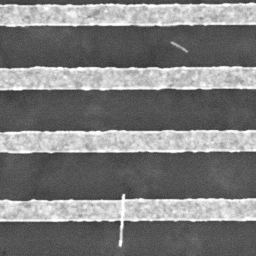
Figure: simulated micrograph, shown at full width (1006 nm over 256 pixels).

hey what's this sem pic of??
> lines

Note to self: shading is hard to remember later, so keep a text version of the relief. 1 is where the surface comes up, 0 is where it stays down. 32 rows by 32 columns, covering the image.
00000000000000000000000000000001
11111111111111111111111111111111
11111111111111111111111111111111
00000000000000000000000000000000
00000000000000000000000000000000
00000000000000000000000000000000
00000000000000000000000000000000
00000000000000000000000000000000
00001100000000000000000000011110
11111111111111111111111111111111
11111111111111111111111111111111
00000000000000000000000000000000
00000000000000000000000000000000
00000000000000000000000000000000
00000000000000000000000000000000
00000000000000000000000000000000
00111001111111111111111111111111
11111111111111111111111111111111
11111111111111111111111111111111
00000000000000000000000000000000
00000000000000000000000000000000
00000000000000000000000000000000
00000000000000000000000000000000
00000000000000000000000000000000
00000000000000000000000000000000
11111111111111111111111111111111
11111111111111111111111111111111
11111111001111011000000110000000
00000000000000000000000000000000
00000000000000000000000000000000
00000000000000000000000000000000
00000000000000000000000000000000